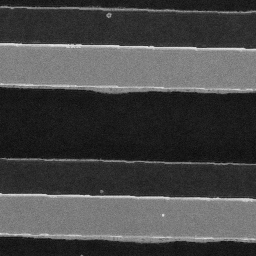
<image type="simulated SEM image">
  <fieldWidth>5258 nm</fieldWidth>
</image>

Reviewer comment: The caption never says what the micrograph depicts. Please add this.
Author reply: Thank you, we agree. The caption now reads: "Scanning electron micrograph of lines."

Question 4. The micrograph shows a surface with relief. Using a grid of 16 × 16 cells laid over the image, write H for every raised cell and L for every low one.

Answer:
HHLLLLLLLLLLLLLL
HHHHHHHHHHHHHHHH
HHHHHHHHHHHHHHHH
HHHHHHHHHHHHHHHH
HHHHHHHHHHHHHHHH
LLLLLLHHHHHHHHHH
LLLLLLLLLLLLLLLL
LLLLLLLLLLLLLLLL
LLLLLLLLLLLLLLLL
LLLLLLLLLLLLLLLL
HHHHHHHHHHHHHHHH
HHHHHHHHHHHHHHHH
HHHHHHHHHHHHHHHH
HHHHHHHHHHHHHHHH
HHHHHHHHHHHHHHHH
LLLLLLLLLLLLLLLL